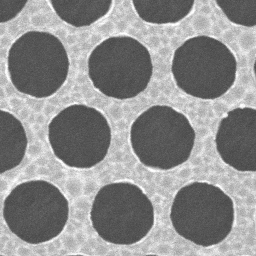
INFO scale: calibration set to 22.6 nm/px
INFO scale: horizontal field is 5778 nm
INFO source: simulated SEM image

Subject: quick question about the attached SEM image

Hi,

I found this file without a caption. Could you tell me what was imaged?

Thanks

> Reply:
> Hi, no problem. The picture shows a regular array of holes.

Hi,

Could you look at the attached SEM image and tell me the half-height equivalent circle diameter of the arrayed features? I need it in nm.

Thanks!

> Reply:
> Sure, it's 1460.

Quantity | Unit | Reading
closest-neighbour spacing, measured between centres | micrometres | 1.83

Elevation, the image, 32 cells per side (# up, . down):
...###........###.......###.....
..#####......####.......####....
.#######....######.....######...
################################
###....########.#########.######
##......####......#####.....####
#.......###........###.......###
#........##........###........##
#........##........##.........##
#.......###........###.......###
##......####......####.......###
###....######.....#####.....####
################################
########....######....########.#
..#####......####......#####....
...###.......####.......###.....
...###........##........###.....
...###........##........###.....
...###........##........###.....
...####......####.......####....
..######....######.....#####....
.###############################
####.###########################
##.....######....######....#####
#.......####......####.......###
.........###.......##........###
.........##........##........###
#.......###........##........###
#.......####.......###.......###
##.....#####......#####.....####
####.#########..########...#####
################################